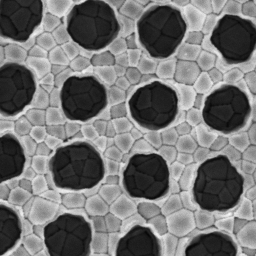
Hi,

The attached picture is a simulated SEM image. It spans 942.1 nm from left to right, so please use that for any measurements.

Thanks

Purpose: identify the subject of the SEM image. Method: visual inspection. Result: holes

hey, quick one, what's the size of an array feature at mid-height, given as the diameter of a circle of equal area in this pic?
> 174 nm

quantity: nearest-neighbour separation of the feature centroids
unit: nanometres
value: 262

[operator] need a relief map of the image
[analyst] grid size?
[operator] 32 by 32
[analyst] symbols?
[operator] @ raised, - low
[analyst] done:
-----@@@@@---@@@@@@@@@@@@@@@@@@@
-----@@@@-----@@@@@---@@@@@@@@@@
-----@@@@------@@------@@@@@---@
----@@@@-------@@------@@@@-----
----@@@@@-----@@@------@@@------
@@@@@@@@@@----@@@@----@@@@@-----
@@@@@@@@@@@@@@@@@@@---@@@@@@---@
@@@@@@@@@@@@@@@@@@@@@@@@@@@@---@
---@@@@@@@@@@@@@@@@@@@@@@@@@@@@@
----@@@@@@@@@@@@@@@@@@@@@@@@@@@@
----@@@@-----@@@@@@-@@@@@@@@@@@@
----@@@@-----@@@@-----@@@@@---@@
----@@@@-----@@@------@@@@-----@
---@@@@@-----@@@------@@@------@
@@@@@@@@----@@@@@-----@@@------@
@@@@@@@@@@@@@@@@@@---@@@@@----@@
@@@@@@@@@@@@@@@@@@@@@@@@@@@@@@@@
--@@@@@@@@@@@@@@@@@@@@@@@@@@@@@@
---@@@@@----@@@@@@@@@@@@@@@@@@@@
---@@@@------@@@@---@@@@@@@-@@@@
---@@@-------@@@-----@@@@----@@@
---@@@@------@@@-----@@@@-----@@
-@@@@@@------@@------@@@------@@
@@@@@@@@---@@@@@-----@@@------@@
@@@@@@@@@@@@@@@@@---@@@@------@@
@@@@@@@@@@@@@@@@@@@@@@@@@-----@@
--@@@@@@@@@@@@@@@@@@@@@@@@@@@@@@
--@@@@@----@@@@@@@@@@@@@@@@@@@@@
---@@@-----@@@@@@-@@@@@@@@@@@@@@
--@@@@-----@@@@----@@@@@@---@@@@
--@@@@-----@@@@-----@@@@-----@@@
-@@@@@-----@@@@-----@@@------@@@